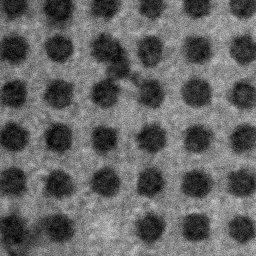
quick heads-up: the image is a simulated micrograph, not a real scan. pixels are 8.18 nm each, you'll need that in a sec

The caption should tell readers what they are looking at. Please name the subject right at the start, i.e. a regular array of raised bodies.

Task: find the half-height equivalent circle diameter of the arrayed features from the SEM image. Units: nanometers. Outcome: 194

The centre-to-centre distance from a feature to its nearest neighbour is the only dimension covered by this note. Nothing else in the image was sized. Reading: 362 nm